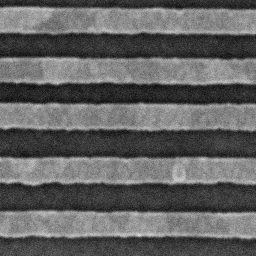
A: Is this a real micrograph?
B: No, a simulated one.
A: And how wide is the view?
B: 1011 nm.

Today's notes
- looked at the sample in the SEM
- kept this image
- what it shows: lines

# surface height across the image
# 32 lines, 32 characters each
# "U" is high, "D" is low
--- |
DDDDDDDDDDDDDDDDDDDDDDDDDDDDDDDD
UUUUUUUUUUUUUUUUUUUUUUUUUUUUUUUU
UUUUUUUUUUUUUUUUUUUUUUUUUUUUUUUU
UUUUUUUUUUUUUUUUUUUUUUUUUUUUUUUU
DDDDDDDDDDDDDDDDDDDDDDDDDDDDDDDD
DDDDDDDDDDDDDDDDDDDDDDDDDDDDDDDD
DDDDDDDDDDDDDDDDDDDDDDDDDDDDDDDD
UUUUUUUUUUUUUUUUUUUUUUUUUUUUDUUU
UUUUUUUUUUUUUUUUUUUUUUUUUUUUUUUU
UUUUUUUUUUUUUUUUUUUUUUUUUUUUUUUU
DDDDDDDDDDDDDDDDDDDDDDDUUUDDDDDD
DDDDDDDDDDDDDDDDDDDDDDDDDDDDDDDD
DDDDDDDDDDDDDDDDDDDDDDDDDDDDDDDD
UUUUUUUUUUUUUUUUUUUUUUUUUUUUUUUU
UUUUUUUUUUUUUUUUUUUUUUUUUUUUUUUU
UUUUUUUUUUUUUUUUUUUUUUUUUUUUUUUU
DDDDDDDDDDDDDDDDDDDDDDDDDDDDDDDD
DDDDDDDDDDDDDDDDDDDDDDDDDDDDDDDD
DDDDDDDDDDDDDDDDDDDDDDDDDDDDDDDD
DDDDDDDDDDDDDDDDDDDDDDDDDDDDDDDD
UUUUUUUUUUUUUUUUUUUUUUUUUUUUUUUU
UUUUUUUUUUUUUUUUUUUUUUUUUUUUUUUU
UUUUUUUUUUUUUUUUUUUUUUUUUUUUUUUU
DDDDDDDDDDDDDDDDDDDDDDDDDDDDDDDD
DDDDDDDDDDDDDDDDDDDDDDDDDDDDDDDD
DDDDDDDDDDDDDDDDDDDDDDDDDDDDDDDD
DDDUUUUDUUDDDDDDDDDDDDDDDDDDDDDD
UUUUUUUUUUUUUUUUUUUUUUUUUUUUUUUU
UUUUUUUUUUUUUUUUUUUUUUUUUUUUUUUU
UUUDDUUUUUUDDDDUDUUUUDDDUUUUUUUU
DDDDDDDDDDDDDDDDDDDDDDDDDDDDDDDD
DDDDDDDDDDDDDDDDDDDDDDDDDDDDDDDD